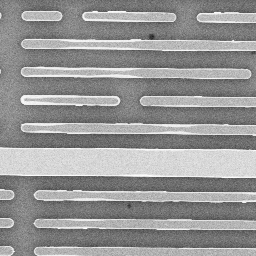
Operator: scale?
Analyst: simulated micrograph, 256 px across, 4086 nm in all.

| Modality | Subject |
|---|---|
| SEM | groups of lines, slits or small figures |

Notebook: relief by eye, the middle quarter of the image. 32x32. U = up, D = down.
DDDDDDDDDDDDDDDDDDDDDDDDDDDDDDDD
UUUUUUUUUUUUUUUUUUUUUUUUUUUUUUUU
UUUUUUUUUUUUUUUUUUUUUUUUUUUUUUUU
DDDDDDDDDDDDDDDDDDDDDDDDDDDDDDDU
DDDDDDDDDDDDDDDDDDDDDDDDDDDDDDDD
DDDDDDDDDDDDDDDDDDDDDDDDDDDDDDDD
DDDDDDDDDDDDDDDDDDDDDDDDDDDDDDDD
DDDDDDDDDDDDDDDDDDDDDDDDDDDDDDDD
UUUUUUUUUUUUUDDDDDDDUUUUUUUUUUUU
UUUUUUUUUUUUUUDDDDDUUUUUUUUUUUUU
DDDDDDDDDDDDDDDDDDDDDDDDDDDDDDDD
DDDDDDDDDDDDDDDDDDDDDDDDDDDDDDDD
DDDDDDDDDDDDDDDDDDDDDDDDDDDDDDDD
DDDDDDDDDDDDDDDDDDDDDDDDDDDDDDDD
DDDDDDDDDDDDDDDDDDDDDDDDDDDDDDDD
UUUUUUUUUUUUUUUUUUUUUUUUUUDDDDDU
UUUUUUUUUUUUUUUUUUUUUUUUUUUUUUUU
DDDDDDDDDDDDDDDDDDDDDDDDDDDDDDDD
DDDDDDDDDDDDDDDDDDDDDDDDDDDDDDDD
DDDDDDDDDDDDDDDDDDDDDDDDDDDDDDDD
DDDDDDDDDDDDDDDDDDDDDDDDDDDDDDDD
UUUUUUUUUUUUUUUUUUUUUUUUUUUUUUUU
UUUUUUUUUUUUUUUUUUUUUUUUUUUUUUUU
UUUUUUUUUUUUUUUUUUUUUUUUUUUUUUUU
UUUUUUUUUUUUUUUUUUUUUUUUUUUUUUUU
UUUUUUUUUUUUUUUUUUUUUUUUUUUUUUUU
UUUUUUUUUUUUUUUUUUUUUUUUUUUUUUUU
UUUUUUUUUUUUUUUUUUUUUUUUUUUUUUUU
DDDDDDDDDDDDDDDDDDDDDDDDDDDDDDDD
DDDDDDDDDDDDDDDDDDDDDDDDDDDDDDDD
DDDDDDDDDDDDDDDDDDDDDDDDDDDDDDDD
DDDDDDDDDDDDDDDDDDDDDDDDDDDDDDDD